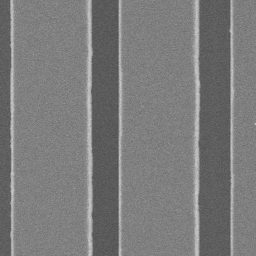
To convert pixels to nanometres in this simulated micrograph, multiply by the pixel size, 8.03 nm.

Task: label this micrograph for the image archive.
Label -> lines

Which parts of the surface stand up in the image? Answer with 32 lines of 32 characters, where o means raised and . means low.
.oooooooooo....oooooooooo....ooo
.oooooooooo....oooooooooo....ooo
.oooooooooo....oooooooooo....ooo
.oooooooooo....oooooooooo....ooo
.oooooooooo....oooooooooo....ooo
.oooooooooo....oooooooooo....ooo
.ooooooooooo...oooooooooo....ooo
.oooooooooo....oooooooooo....ooo
.oooooooooo....oooooooooo....ooo
.oooooooooo....oooooooooo....ooo
.oooooooooo....oooooooooo....ooo
.oooooooooo....oooooooooo....ooo
.oooooooooo....oooooooooo....ooo
.oooooooooo....oooooooooo....ooo
.oooooooooo....oooooooooo....ooo
.oooooooooo....oooooooooo....ooo
.oooooooooo....oooooooooo....ooo
.oooooooooo....oooooooooo....ooo
.oooooooooo....oooooooooo....ooo
.ooooooooooo...oooooooooo....ooo
.oooooooooo....oooooooooo....ooo
.oooooooooo....oooooooooo....ooo
.oooooooooo....oooooooooo....ooo
.oooooooooo....oooooooooo....ooo
.ooooooooooo...oooooooooo....ooo
.oooooooooo....oooooooooo....ooo
.oooooooooo....oooooooooo....ooo
.oooooooooo....oooooooooo....ooo
.oooooooooo....oooooooooo....ooo
.ooooooooooo...oooooooooo....ooo
.ooooooooooo...oooooooooo....ooo
.ooooooooooo...oooooooooo....ooo